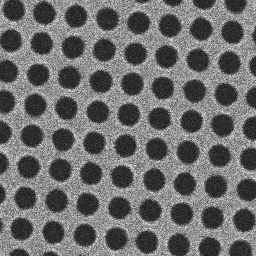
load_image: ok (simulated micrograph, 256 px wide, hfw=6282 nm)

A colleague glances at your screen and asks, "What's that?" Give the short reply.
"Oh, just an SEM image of a regular array of holes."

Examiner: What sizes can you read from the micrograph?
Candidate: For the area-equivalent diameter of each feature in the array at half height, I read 23.9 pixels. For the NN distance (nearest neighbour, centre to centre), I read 754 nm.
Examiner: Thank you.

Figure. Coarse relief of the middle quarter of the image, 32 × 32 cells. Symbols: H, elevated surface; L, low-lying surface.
HLHHHHHHHHHHHHHHHHHHHHHHLLLLHHHL
LLLLHHHHLLHHHHHHHHHHHHHHHHHHHHHH
LLLLHHHLLLLHHHHLLLHHHHHHHHHHHHHH
LLLLHHLLLLLLHHHLLLLLHHHLLLHHHHHH
LLLLHHLLLLLLHHLLLLLLHHLLLLLHHHHL
LLLLHHLLLLLLHHLLLLLLHHLLLLLLHHLL
HHHHHHHLLLLLHHHLLLLLHHLLLLLLHHLL
HHHHHHHHHHHHHHHLLLLHHHLLLLLHHHLL
LLHHHHHHHHHHHHHHHHHHHHHLLLLHHHLL
LLLHHHHLLLHHHHHHHHHHHHHHHHHHHHHH
LLLLHHLLLLLHHHLLLLHHHHHHHHHHHHHH
LLLLHLLLLLLHHLLLLLLHHHLLLLHHHHHL
LLLHHLLLLLLHHLLLLLLHHLLLLLLHHHLL
LLLHHHLLLLLHHLLLLLLHHLLLLLLHHLLL
HHHHHHHLLLHHHHLLLLLHHLLLLLLHHLLL
HHHHHHHHHHHHHHHLLLHHHLLLLLHHHLLL
LHHHHHHHHHHHHHHHHHHHHHHLLHHHHHLL
LLHHHLLLLHHHHHHLHHHHHHHHHHHHHHHH
LLLHHLLLLLHHHLLLLLHHHHLLHHHHHHHH
LLLHHLLLLLLHHLLLLLHHHLLLLHHHHLLL
LLHHHLLLLLHHLLLLLLHHLLLLLLHHHLLL
LHHHHLLLLLHHLLLLLLHHLLLLLLHHLLLL
HHHHHHLLLHHHHLLLLLHHHLLLLLHHLLLL
HHHHHHHHHHHHHHHLHHHHHLLLLHHHLLLL
LHHHHHLHHHHHHHHHHHHHHHHHHHHHHLLL
LLHHLLLLLHHHHLLLHHHHHHHHHHHHHHHH
LLHHLLLLLLHHLLLLLHHHHLLLHHHHHHHH
LLHHLLLLLLHHLLLLLHHHLLLLLHHHHLLL
LHHHLLLLLLHHLLLLLHHHLLLLLHHHLLLL
HHHHHLLLLHHHLLLLLHHHLLLLLHHLLLLL
HHHHHHHHHHHHHLLLLHHHLLLLLHHLLLLL
HHHHHHHHHHHHHHHHHHHHHLLLHHHHLLLL